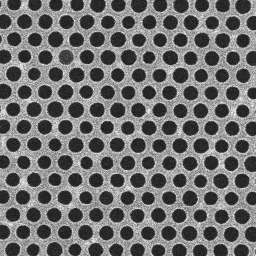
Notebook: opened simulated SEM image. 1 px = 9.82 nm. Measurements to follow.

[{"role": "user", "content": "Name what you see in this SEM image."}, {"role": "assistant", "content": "a regular array of holes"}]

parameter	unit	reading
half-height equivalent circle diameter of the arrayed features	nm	141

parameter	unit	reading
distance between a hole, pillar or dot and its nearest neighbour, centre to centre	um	0.198